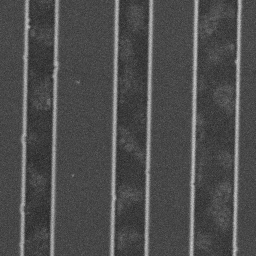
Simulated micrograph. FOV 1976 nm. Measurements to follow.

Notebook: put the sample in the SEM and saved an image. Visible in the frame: one or a few lines or trenches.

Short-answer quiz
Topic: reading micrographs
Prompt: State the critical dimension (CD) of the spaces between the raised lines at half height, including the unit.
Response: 254 nanometres